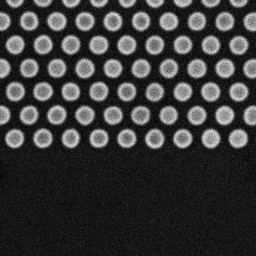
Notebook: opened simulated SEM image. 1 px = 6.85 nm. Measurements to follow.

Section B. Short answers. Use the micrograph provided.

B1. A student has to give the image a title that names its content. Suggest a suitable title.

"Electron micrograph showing a regular array of raised bodies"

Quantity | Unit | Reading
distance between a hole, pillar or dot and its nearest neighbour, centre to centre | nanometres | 185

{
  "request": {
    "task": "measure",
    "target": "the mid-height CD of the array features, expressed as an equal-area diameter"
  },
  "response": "16.7 px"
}